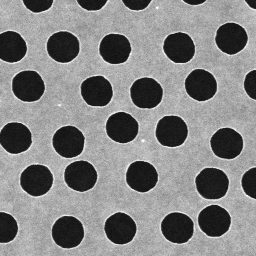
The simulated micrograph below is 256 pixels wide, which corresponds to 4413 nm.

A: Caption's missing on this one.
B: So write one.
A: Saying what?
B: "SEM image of a regular array of holes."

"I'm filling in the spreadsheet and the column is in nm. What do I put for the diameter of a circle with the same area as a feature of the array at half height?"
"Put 556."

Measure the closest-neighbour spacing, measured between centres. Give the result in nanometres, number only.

752